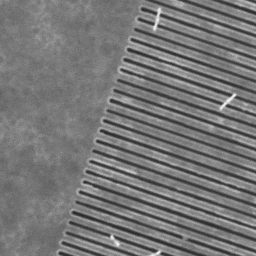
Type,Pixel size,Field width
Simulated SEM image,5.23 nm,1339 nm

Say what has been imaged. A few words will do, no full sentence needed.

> parallel lines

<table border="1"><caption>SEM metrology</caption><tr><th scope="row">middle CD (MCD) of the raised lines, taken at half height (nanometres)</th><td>34.7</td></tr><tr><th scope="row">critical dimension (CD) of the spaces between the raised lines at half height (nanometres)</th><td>19.8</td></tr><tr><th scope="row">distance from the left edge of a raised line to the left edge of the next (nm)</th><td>56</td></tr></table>